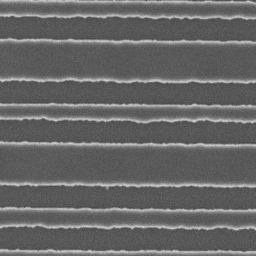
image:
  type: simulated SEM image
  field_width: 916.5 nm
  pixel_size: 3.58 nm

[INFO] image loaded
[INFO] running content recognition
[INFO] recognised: lines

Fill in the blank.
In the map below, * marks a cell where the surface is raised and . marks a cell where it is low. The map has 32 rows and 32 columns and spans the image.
********************************
********************************
................................
................................
................................
********************************
********************************
********************************
********************************
********************************
................................
................................
................................
********************************
********************************
................................
................................
................................
********************************
********************************
********************************
********************************
********************************
................................
................................
................................
********************************
********************************
.............*.......*.****..***
................................
................................
********************************